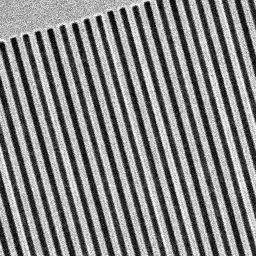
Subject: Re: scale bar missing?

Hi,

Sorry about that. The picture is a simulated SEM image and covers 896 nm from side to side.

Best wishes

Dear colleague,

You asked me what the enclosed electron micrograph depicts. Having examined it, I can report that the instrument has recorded parallel lines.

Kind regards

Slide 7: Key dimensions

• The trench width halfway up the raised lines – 6.14 px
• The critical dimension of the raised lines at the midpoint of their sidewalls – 21.5 nanometers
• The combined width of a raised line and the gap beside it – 44 nanometers